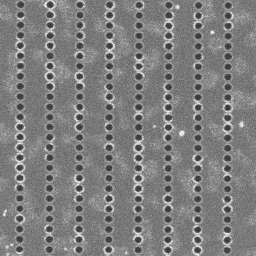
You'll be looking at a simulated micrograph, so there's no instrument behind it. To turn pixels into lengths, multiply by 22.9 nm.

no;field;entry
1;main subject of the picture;a regular array of holes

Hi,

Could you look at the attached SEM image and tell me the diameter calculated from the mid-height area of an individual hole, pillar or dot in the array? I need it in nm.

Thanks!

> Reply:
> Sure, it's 171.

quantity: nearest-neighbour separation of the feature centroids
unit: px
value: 9.97